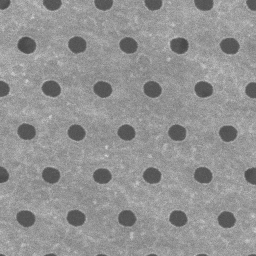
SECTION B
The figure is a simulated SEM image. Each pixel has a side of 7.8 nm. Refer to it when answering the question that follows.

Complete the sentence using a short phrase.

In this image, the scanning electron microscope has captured a regular array of holes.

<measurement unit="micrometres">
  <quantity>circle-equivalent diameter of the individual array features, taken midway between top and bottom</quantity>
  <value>0.145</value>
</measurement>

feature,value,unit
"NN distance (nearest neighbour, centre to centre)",385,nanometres